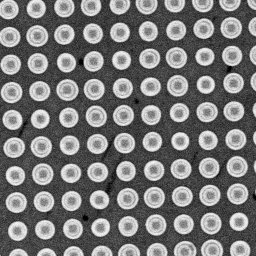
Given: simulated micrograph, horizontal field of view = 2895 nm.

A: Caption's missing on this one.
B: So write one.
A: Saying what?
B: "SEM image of an array of small figures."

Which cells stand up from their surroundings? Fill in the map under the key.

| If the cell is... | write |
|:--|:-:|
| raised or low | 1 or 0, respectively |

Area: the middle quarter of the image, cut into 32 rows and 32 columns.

11100111100001110000111000011100
11000011100000000000000000000000
00000000000000000000000000000000
00000000000000000000010000011100
11100011100001111000111100111110
11100111110011111001111100111110
11100111110011111001111100111110
11100111110001111000111000011100
11100011100000100000000000000000
00000000000000000000000000000000
00000000000000110000011000011100
11100011110001111000111100011110
11100011111011111001111100011110
11100011111011111000111100011110
11100011110001111000111000000000
11000001100000000000000000000000
00000000000000000000000000000000
00000000000000110000011000001100
11100011110001111000111100011110
11110011111001111100111100011110
11110011111001111100111100011110
11110011110001111000011000000000
01000000000000000000000000000000
00000000000000000000000000000000
00000000000000010000011100011110
11100001110001111000111110011111
11110011111001111100111110011111
11110011111001111100111110011110
11110011110000111000011100001100
01000000000000000000000000000000
00000000000000000000000000000000
00000000000000011000011100001111